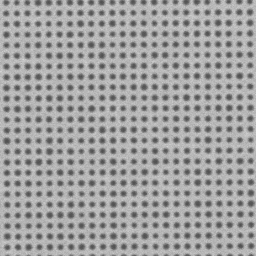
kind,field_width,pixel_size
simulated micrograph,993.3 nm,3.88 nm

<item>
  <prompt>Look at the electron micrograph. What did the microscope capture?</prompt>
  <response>a regular array of holes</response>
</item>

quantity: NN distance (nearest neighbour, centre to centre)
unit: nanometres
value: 40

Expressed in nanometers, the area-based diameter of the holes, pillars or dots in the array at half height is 25.1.